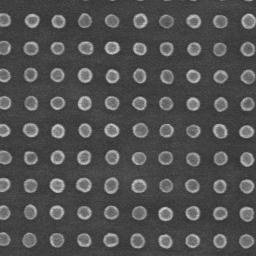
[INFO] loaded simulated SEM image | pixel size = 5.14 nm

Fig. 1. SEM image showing a regular array of raised bodies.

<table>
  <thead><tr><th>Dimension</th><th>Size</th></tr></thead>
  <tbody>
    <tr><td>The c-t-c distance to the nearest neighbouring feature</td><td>0.136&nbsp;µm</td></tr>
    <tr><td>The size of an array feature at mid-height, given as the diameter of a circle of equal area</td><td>69.4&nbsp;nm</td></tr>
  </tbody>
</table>